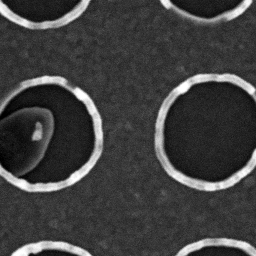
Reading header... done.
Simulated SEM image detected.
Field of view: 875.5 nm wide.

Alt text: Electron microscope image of holes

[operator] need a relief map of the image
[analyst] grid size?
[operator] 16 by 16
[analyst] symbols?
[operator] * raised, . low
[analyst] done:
*....******....*
****************
****************
****************
****************
**..********...*
.....******.....
......****......
......****......
......****......
.....******....*
****************
****************
****************
****************
*************..*